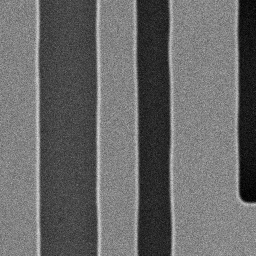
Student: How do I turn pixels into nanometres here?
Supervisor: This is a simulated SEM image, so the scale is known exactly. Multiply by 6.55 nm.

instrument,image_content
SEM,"groups of lines, slits or small figures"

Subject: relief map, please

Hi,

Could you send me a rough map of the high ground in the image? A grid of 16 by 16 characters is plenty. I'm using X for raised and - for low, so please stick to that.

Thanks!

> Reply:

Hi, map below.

XX----XX---XXXX-
XX----XX---XXXX-
XX----XX---XXXX-
XX----XX---XXXX-
XX----XXX--XXXX-
XX----XXX--XXXX-
XX----XXX--XXXX-
XX----XXX--XXXX-
XX----XXX--XXXX-
XX----XXX--XXXX-
XX----XXX--XXXX-
XX----XXX--XXXX-
XX----XXX--XXXX-
XX----XXX--XXXXX
XX----XXX--XXXXX
XX----XXX--XXXXX